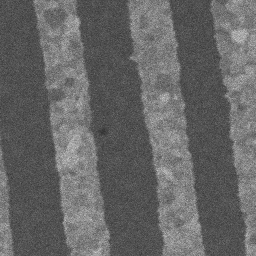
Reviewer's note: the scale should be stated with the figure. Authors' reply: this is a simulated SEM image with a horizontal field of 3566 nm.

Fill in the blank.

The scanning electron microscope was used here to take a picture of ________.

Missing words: one or a few lines or trenches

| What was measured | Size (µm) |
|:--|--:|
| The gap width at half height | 0.725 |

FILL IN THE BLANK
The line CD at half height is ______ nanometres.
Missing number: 524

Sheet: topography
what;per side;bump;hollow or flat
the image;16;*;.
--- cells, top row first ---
..***...***..***
..***...***..***
...**...***...**
...**...***...**
...**....**...**
...**....**...**
...***...**...**
...***...***..**
...***...***..**
....**....**...*
....**....**...*
....**....**...*
....**....**...*
*...**....**...*
*...***...***..*
*...***...***..*